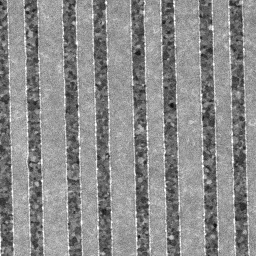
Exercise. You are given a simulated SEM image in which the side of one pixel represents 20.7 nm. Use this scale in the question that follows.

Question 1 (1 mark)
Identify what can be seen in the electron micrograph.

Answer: parallel lines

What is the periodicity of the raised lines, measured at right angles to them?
706 nanometres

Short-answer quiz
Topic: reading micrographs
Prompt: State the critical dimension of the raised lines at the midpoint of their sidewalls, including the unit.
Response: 290 nm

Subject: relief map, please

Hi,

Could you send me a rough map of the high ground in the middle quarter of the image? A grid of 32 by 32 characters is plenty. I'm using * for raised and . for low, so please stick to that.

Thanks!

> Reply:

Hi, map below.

***.....***......***.....***....
***.....***......***.....***....
***.....***......***.....***....
***.....***......***.....***....
***.....***......***.....***....
***.....***......***.....***....
****....***......****....***....
****....***......****....***....
****....***......****....***....
***.....***......****....***....
****....***......****....***....
****....***......****....***....
****....***......****....***....
****....***......****....***....
****....***......****....***....
****....***......****....***....
****....***......****....***....
****....***.......***....***....
.***....***.......***....***....
.***....***.......***....****...
.***....***.......***....***....
.***....***.......***....***....
.***....***.......***....***....
.***....***.......***....***....
.***....***.......***....****...
.***....***.......***....***....
.***....****......***....****...
.***....***.......***....***....
.***....****......***....****...
.***....****......***....****...
.***....****......***....****...
.***....****......***....****...